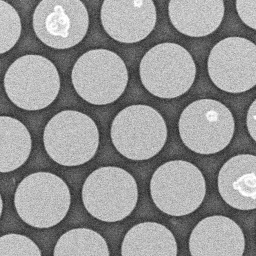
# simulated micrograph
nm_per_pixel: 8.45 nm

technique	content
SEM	an array of small figures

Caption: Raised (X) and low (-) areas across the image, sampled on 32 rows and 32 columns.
X----XXXXX---XXXXXX--XXXXXXX--XX
XX--XXXXXXX--XXXXXX--XXXXXXX--XX
XX--XXXXXXX--XXXXXX--XXXXXXX--XX
XXX-XXXXXXX--XXXXXX---XXXXX-----
XX---XXXXX----XXXX------X-------
XX----XXX-----------XX-----XXXXX
X----------XXX----XXXXX---XXXXXX
--XXXX----XXXXX---XXXXXX--XXXXXX
-XXXXXX--XXXXXXX--XXXXXX--XXXXXX
-XXXXXX--XXXXXXX--XXXXXX--XXXXXX
-XXXXXX--XXXXXXX--XXXXXX---XXXXX
-XXXXXX---XXXXX----XXXX------X--
-XXXXXX----XXX-----------XX-----
---XX-----------XXX----XXXXX---X
-------XXXX----XXXXX---XXXXXX--X
XXX---XXXXXX--XXXXXXX-XXXXXXX--X
XXXX--XXXXXX--XXXXXXX-XXXXXXX--X
XXXX-XXXXXXX--XXXXXXX--XXXXXX---
XXXX--XXXXXX---XXXXX----XXXX----
XXX---XXXXXX----XXX-----------XX
XXX-----XX-----------XXX----XXXX
------------XXXX---XXXXXX--XXXXX
---XXXXX---XXXXXX--XXXXXX--XXXXX
--XXXXXX--XXXXXXX--XXXXXXX-XXXXX
--XXXXXXX-XXXXXXX--XXXXXXX--XXXX
--XXXXXXX--XXXXXX--XXXXXX----XXX
--XXXXXX---XXXXX-----XXX--------
---XXXXX-----XX----------XXXX---
-----------------XXXX---XXXXXX--
-XX-----XXXXX---XXXXXX--XXXXXX--
XXXX---XXXXXX--XXXXXXX--XXXXXXX-
XXXXX--XXXXXXX-XXXXXXX--XXXXXX--